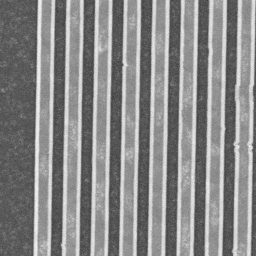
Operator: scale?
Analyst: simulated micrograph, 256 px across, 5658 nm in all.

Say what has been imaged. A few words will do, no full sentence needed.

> parallel lines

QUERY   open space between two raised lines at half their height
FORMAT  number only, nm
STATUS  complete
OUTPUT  337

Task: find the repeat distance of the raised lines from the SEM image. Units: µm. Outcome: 0.631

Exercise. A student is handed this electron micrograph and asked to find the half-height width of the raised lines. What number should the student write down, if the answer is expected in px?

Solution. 13.4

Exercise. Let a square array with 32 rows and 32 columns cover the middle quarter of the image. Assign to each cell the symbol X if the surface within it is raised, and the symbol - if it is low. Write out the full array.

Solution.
-XXX----XXX----XXX----XXXX----XX
-XXX----XXX----XXX----XXXX----XX
-XXX----XXX----XXX----XXX-----XX
-XXX----XXX----XXX----XXX-----XX
-XXX----XXX----XXX----XXX-----XX
-XXX----XXX----XXX----XXX-----XX
-XXX----XXX----XXX----XXX----XXX
-XXX----XXX----XXX----XXX----XXX
-XXX----XXX----XXX----XXX----XXX
-XXX----XXX----XXX----XXX----XXX
-XXX----XXX----XXX----XXX----XXX
-XXX----XXX----XXX----XXX----XXX
-XXX----XXX----XXX----XXX----XXX
-XXX----XXX----XXX----XXX----XXX
-XXX----XXX----XXX----XXX----XXX
-XXX----XXX----XXX----XXX----XXX
-XXX----XXX----XXX----XXX----XXX
-XXX----XXX----XXX----XXX----XXX
-XXX----XXX----XXX----XXX----XXX
-XXX----XXX----XXX----XXX----XXX
-XXX----XXX----XXX----XXX----XXX
-XXX----XXX----XXX----XXX----XXX
-XXX----XXX----XXX----XXX----XXX
-XXX----XXX----XXX----XXX----XXX
XXXX----XXX----XXX----XXX----XXX
XXXX----XXX----XXX----XXX----XXX
XXXX----XXX----XXX----XXX----XXX
XXXX----XXX----XXX----XXX----XXX
XXXX----XXX----XXX----XXX----XXX
XXXX----XXX----XXX----XXX----XXX
XXX-----XXX----XXX----XXX----XXX
XXX-----XXX----XXX----XXX----XXX